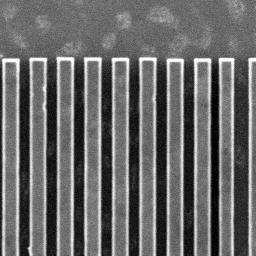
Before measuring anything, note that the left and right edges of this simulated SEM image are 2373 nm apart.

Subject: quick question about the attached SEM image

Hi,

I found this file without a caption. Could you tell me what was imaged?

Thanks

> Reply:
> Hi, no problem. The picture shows parallel lines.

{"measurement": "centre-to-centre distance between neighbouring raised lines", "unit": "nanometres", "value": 250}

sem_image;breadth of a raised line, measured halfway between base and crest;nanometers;138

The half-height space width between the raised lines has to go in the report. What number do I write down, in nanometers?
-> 111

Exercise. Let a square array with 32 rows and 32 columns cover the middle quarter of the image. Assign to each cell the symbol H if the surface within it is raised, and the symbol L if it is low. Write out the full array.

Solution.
HHLLLHHHHLLLHHHHLLLHHHHLLLHHHHLL
HHLLLHHHHLLLHHHHLLLHHHHLLLHHHHLL
HHLLLLHHHLLLHHHHLLLHHHHLLLHHHHLL
HHLLLLHHHLLLHHHHLLLHHHHLLLHHHHLL
HHLLLLHHHLLLHHHHLLLHHHHLLLHHHHLL
HHLLLLHHHLLLHHHHLLLHHHHLLLHHHHLL
HHLLLLHHHLLLHHHHLLLHHHHLLLHHHHLL
HHLLLLHHHLLLHHHHLLLHHHHLLLHHHHLL
HHLLLLHHHLLLHHHHLLLHHHHLLLHHHHLL
HHLLLHHHHLLLHHHHLLLHHHHLLLHHHHLL
HHLLLLHHHLLLHHHHLLLHHHHLLLHHHHLL
HHLLLLHHHLLLHHHHLLLHHHHLLLHHHHLL
HHLLLLHHHLLLHHHHLLLHHHHLLLHHHHLL
HHLLLLHHHLLLHHHHLLLHHHHLLLHHHHLL
HHLLLHHHHLLLHHHHLLLHHHHLLLHHHHLL
HHLLLHHHHLLLHHHHLLLHHHHLLLHHHHLL
HHLLLHHHHLLLHHHHLLLHHHHLLLHHHHLL
HHLLLHHHHLLLHHHHLLLHHHHLLLHHHHLL
HHLLLHHHHLLLHHHHLLLHHHHLLLHHHHLL
HHLLLHHHHLLLHHHHLLLHHHHLLLHHHHLL
HHLLLLHHHLLLHHHHLLLHHHHLLLHHHHLL
HHLLLLHHHLLLHHHHLLLHHHHLLLHHHHLL
HHLLLLHHHLLLHHHHLLLHHHHLLLHHHHLL
HHLLLLHHHLLLHHHHLLLHHHHLLLHHHHLL
HHLLLLHHHLLLHHHHLLLHHHHLLLHHHHLL
HHLLLLHHHLLLHHHHLLLHHHHLLLHHHHLL
HHLLLLHHHLLLHHHHLLLHHHHLLLHHHHLL
HHLLLHHHHLLLHHHHLLLHHHHLLLHHHHLL
HHLLLHHHHLLLHHHHLLLHHHHLLLHHHHLL
HHLLLHHHHLLLHHHHLLLHHHHLLLHHHHLL
HHLLLHHHHLLLHHHHLLLHHHHLLLHHHHLL
HHLLLHHHHLLLHHHHLLLHHHHLLLHHHHLL